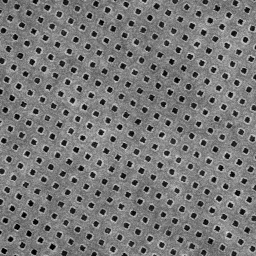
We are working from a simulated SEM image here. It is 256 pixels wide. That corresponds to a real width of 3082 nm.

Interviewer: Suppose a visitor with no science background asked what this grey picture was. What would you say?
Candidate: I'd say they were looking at a regular array of holes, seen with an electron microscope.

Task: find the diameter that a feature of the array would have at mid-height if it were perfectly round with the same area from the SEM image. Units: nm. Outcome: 80.4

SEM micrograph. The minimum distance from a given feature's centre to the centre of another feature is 161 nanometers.